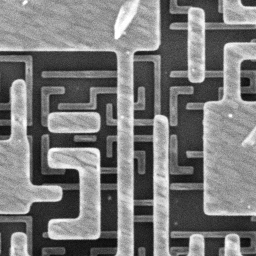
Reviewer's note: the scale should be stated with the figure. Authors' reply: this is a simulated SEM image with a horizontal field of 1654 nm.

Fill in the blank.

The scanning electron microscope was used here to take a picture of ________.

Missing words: wiring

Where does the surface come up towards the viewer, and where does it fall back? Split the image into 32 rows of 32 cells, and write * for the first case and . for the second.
********************........**..
********************....*...****
********************....**..****
********************....**......
********************....**......
********************....**..****
..............***.......**..****
...............**.......**..***.
...............**.......**..**..
...............**.......**..**..
..*............**...........**..
.**............**...........**..
.**............**..........***..
.**............**.........******
.**...******...**.........******
..*...*******..**..**.....******
.**....*****...**..**.....******
.***...........**..**.....******
****...........**..**.....******
****..******...**..**.....******
****..******...**..**.....******
****......**...**..**.....******
****......**...**..**.....******
********..***..**..**.....******
********..***..**..**.....******
****......***..**..**.....******
***.......***..**..**.....******
......*******..**..**...........
......*******..**..**...........
..*...******...**..**...*...**..
.**............**..**...**..**..
.**............**..**...**..**..